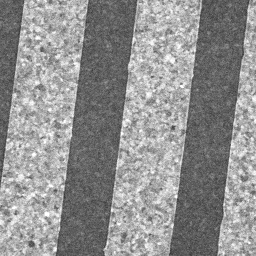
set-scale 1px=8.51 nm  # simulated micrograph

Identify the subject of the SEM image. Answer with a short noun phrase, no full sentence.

one or a few lines or trenches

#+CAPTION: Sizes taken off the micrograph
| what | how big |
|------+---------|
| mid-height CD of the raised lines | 0.532 microns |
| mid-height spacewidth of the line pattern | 419 nm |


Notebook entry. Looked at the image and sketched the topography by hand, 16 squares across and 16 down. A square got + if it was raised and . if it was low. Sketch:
.++++....++++...
.++++...++++...+
.++++...++++...+
.++++...++++...+
.++++...++++...+
.++++...++++...+
.++++...++++...+
.++++...++++...+
++++....++++...+
++++...++++...++
++++...++++...++
++++...++++...++
++++...++++...++
++++...++++...++
++++...++++...++
++++...++++...++